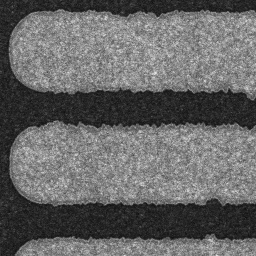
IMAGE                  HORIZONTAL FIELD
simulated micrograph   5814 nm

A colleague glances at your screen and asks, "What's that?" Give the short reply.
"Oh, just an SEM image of one or a few lines or trenches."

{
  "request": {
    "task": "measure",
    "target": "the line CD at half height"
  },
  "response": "826 nanometres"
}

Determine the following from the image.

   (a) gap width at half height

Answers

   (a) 1760 nm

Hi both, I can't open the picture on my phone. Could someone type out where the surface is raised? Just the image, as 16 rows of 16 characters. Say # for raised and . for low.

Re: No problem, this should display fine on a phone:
################
#...............
#...............
#...............
#...............
##..............
################
################
#...............
#...............
#...............
#...............
##..............
################
################
#...............